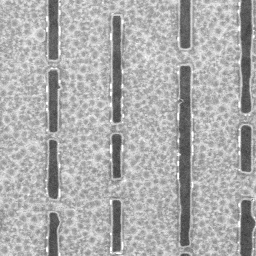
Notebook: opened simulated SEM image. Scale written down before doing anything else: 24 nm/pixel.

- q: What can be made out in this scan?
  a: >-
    one or a few lines or trenches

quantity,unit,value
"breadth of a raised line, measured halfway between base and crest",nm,258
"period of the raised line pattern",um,1.55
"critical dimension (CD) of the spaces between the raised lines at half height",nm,1290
